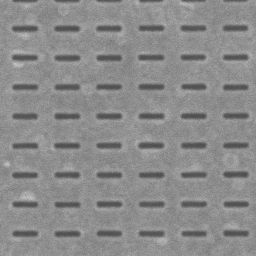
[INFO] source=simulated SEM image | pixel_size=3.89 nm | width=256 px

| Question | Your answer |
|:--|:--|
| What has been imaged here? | a regular array of holes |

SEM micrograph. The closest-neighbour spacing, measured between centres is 113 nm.